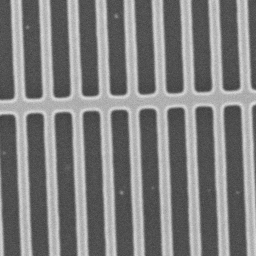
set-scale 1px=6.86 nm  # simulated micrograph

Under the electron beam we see groups of lines, slits or small figures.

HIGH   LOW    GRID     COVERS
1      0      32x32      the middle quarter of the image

00110000011000001100000110000011
00110000011000001100000110000011
00110000011000001100000110000011
00110000011000001100000110000011
00110000011000001100000110000011
00110000011000001100000110000011
00110000011000001100000110000011
00110000011000001110000111000111
11111111111111111111111111111111
11111111111111111111111111111111
11111111111111111111111111111111
11111100111100001110000111000011
00111000011100001110000110000001
00110000011000001110000110000001
00110000011100001110000111000001
00110000011100001110000011000001
00110000011100001110000011000001
00111000011100000110000011000001
00111000011100000110000011000001
00111000001100000110000011000001
00111000001100000110000011000001
00111000001100000110000011000001
00011000001100000110000011000001
00011000001100000110000011000001
00011000001100000110000011000001
00011000001100000110000011000001
00011000001100000110000011000001
00011000001100000110000011000001
00011000001100000110000011000001
00011000001100000110000011000001
00011000001100000110000011000001
00011000001100000110000011000001